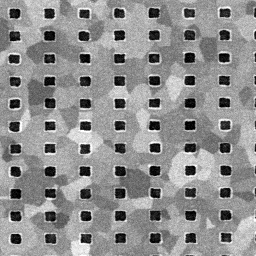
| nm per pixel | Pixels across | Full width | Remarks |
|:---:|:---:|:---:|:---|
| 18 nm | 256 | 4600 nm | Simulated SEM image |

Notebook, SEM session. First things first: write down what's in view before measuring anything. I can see a regular array of holes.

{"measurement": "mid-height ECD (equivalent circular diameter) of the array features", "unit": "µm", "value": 0.213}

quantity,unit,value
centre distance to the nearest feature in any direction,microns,0.4